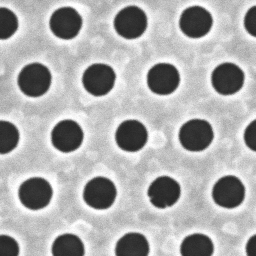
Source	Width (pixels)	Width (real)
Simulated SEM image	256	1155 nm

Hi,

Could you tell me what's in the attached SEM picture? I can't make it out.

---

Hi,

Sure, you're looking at a regular array of holes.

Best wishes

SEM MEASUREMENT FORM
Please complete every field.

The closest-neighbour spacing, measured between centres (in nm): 291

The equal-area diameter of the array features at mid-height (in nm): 151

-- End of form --